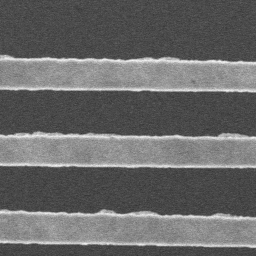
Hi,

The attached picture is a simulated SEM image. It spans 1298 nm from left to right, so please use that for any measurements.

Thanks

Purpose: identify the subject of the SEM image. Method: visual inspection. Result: lines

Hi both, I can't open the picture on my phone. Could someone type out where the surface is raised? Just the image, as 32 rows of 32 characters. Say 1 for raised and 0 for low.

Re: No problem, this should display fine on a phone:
00000000000000000000000000000000
00000000000000000000000000000000
00000000000000000000000000000000
00000000000000000000000000000000
00000000000000000000000000000000
00000000000000000000000000000000
00000000000000000000000000000000
11111111111111101011100000000000
11111111111111111111111111111111
11111111111111111111111111111111
11111111111111111111111111111111
00000000000000000000000000000000
00000000000000000000000000000000
00000000000000000000000000000000
00000000000000000000000000000000
00000000000000000000000000000000
00000000000000000000000000000000
11111111111111111111111111111111
11111111111111111111111111111111
11111111111111111111111111111111
11111111111111111111111111111111
00000000000000000000000000000000
00000000000000000000000000000000
00000000000000000000000000000000
00000000000000000000000000000000
00000000000000000000000000000000
11111000000000000000000000000000
11111111111111111111111111111111
11111111111111111111111111111111
11111111111111111111111111111111
00000000001011111111111111111111
00000000000000000000000000000000